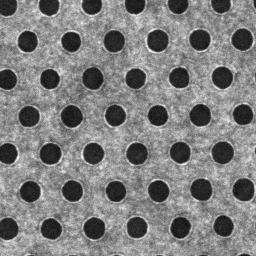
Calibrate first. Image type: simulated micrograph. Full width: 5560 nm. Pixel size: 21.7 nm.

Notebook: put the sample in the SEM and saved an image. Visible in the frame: a regular array of holes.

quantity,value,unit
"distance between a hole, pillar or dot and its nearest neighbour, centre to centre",0.92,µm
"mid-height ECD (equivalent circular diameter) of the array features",490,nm